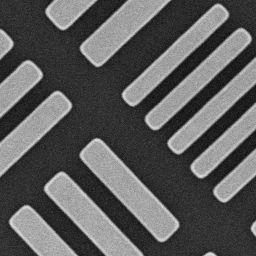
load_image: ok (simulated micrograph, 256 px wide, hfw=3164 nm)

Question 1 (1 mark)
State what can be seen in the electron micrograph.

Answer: groups of lines, slits or small figures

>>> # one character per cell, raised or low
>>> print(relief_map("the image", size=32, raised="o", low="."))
......ooooo.....ooooo...........
......oooo.....ooooo......oo....
.......oo.....ooooo......ooo....
............oooooo......ooo.....
o..........ooooo.......ooo...oo.
o.........ooooo.......ooo...ooo.
o.........oooo.......ooo...ooo..
...........oo.......ooo...ooo...
..ooo..............ooo...ooo...o
.oooo.............ooo...ooo...oo
oooo.............ooo...ooo...ooo
ooo.............ooo...ooo...ooo.
oo....oo........oo...ooo..oooo..
o....oooo..........oooo..oooo..o
....oooo..........ooo...oooo..oo
...oooo............o...ooo...ooo
..oooo................ooo...ooo.
.oooo................ooo...ooo..
oooo.......oo........oo...ooo...
ooo.......oooo...........ooo...o
o..........oooo.........ooo...oo
............oooo........oo...ooo
......ooo....oooo...........ooo.
......oooo....oooo.........ooo..
......ooooo....oooo........oo...
.......ooooo....oooo............
..oo....ooooo....oooo...........
.oooo....ooooo...ooooo..........
..oooo....ooooo...oooo..........
...oooo....ooooo...oo...........
....oooo....oooo................
.....oooo....oooo...............